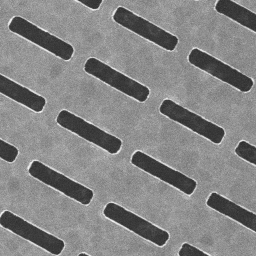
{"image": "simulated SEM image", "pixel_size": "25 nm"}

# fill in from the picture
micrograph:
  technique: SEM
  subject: a regular array of holes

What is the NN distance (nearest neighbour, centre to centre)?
1.46 microns